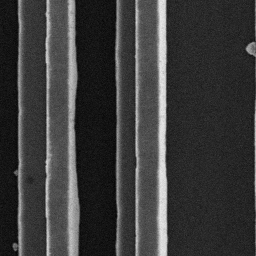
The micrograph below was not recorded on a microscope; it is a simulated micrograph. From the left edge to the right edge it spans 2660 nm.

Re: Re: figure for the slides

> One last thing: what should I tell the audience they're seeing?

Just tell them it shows lines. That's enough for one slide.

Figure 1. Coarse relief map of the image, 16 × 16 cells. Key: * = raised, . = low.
.***...***......
.***...***......
.***...***......
.***...***......
.****..***......
.****..***......
.***...***......
.***...***......
.***...***......
.***...***......
.***...***......
.****..***......
.****..***......
.****..***......
.****..***......
.****..***......